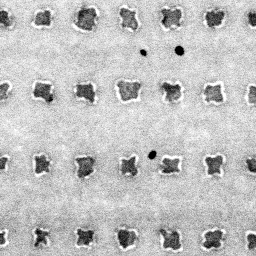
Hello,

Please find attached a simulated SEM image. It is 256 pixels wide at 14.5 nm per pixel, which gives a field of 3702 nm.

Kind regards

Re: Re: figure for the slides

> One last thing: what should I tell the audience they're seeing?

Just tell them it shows a regular array of raised bodies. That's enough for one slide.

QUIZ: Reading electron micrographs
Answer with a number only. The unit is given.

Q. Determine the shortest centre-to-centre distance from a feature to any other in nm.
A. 610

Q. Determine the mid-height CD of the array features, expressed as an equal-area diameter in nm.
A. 307